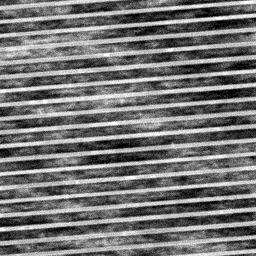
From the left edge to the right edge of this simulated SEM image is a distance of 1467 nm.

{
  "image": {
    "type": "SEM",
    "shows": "parallel lines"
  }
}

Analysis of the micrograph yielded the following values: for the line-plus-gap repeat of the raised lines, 79.1 nanometers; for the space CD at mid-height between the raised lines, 57.9 nm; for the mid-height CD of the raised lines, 3.61 px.